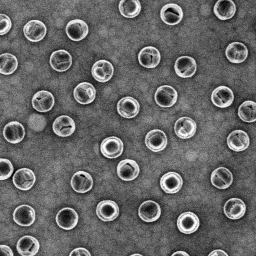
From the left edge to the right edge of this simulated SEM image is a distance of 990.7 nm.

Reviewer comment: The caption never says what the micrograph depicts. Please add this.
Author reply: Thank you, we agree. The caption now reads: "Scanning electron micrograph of a regular array of raised bodies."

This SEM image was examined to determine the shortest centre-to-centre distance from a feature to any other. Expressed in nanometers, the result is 140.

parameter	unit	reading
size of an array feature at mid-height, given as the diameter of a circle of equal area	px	21